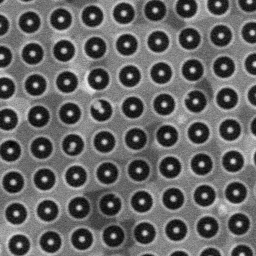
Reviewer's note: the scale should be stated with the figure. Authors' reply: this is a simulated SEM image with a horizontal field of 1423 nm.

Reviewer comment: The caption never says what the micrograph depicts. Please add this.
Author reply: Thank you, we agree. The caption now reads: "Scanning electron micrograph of an array of small figures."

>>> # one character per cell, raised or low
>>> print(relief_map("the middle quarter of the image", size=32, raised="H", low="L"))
HHHHHHHHHHHHHHHLLLHHHHLLLLLHHLLL
LHHHHHHLLLLHHHLLLLLHHHLLLLLHHLLL
LLLHHHLLLLLHHHLLLLLHHLLLLLLHHLLL
LLLLHHLLHLLLHLLLLLLHHHLLLLLHHHLL
HLLLHHLLLLLHHHLLLLLHHHLLLLHHHHHH
LLLHHHLLLLLHHHHLLLHHHHHHHHHHHHHH
LLLHHHHLLLHHHHHHHHHHHHHHHHHHHHHH
HHHHHHHHHHHHHHHHHHHHHHHHLLHHHHHL
HHHHHHHHHHHHHHHLLLLHHHLLLLLHHHLL
HLHHHHHLLLLHHHLLLLLLHHLLLLLLHHLL
LLLLHHHLHLLLHHLLLLLLHHLLLLLLHHLL
LLLLHHLLLLLLHHLLLLLLHHLLLLLLHHHL
LHLLHHHLLLLLHHHLLLLLHHHLLLLHHHHH
LLLLHHHLLLLLHHHHLLHHHHHHHHHHHHHH
LLLLHHHHHLHHHHHHHHHHHHHHHHHHHHHH
HHHHHHHHHHHHHHHHHHHHHHHHLLLHHHHL
HHHHHHHHHHHHHHHHLLLLHHHLLLLLHHHL
HLLHHHHHLLLLHHHLLLLLHHHLLLLLLHHL
LLLLLHHLLLLLLHHLLLLLLHHLLLLLLHHL
LLLLLHHLLLLLLHHLLLLLLHHLLLLLHHHH
LLHLLHHLLLLLLHHLLLLLHHHHLLLHHHHH
LLLLLHHHLLLLHHHHHLLHHHHHHHHHHHHH
LLLLHHHHHHLHHHHHHHHHHHHHHHHHHHHH
HHHHHHHHHHHHHHHHHHHHHHHHHLLLHHHH
HHHHHHHHHHLLHHHHHLLLLHHHLLLLLHHL
HHLLHHHHLLLLLHHHLLLLLHHHLLHLLLHL
LLLLLHHHLLLLLLHHLLLLLLHHLLLLLHHH
LLLLLLHHLLLLLLHHLLLLLHHHLLLLLHHH
LLLLLLHHLLLLLLHHLLLLLHHHHLLLHHHH
LLLLLLHHHLLLLHHHHHLHHHHHHHHHHHHH
HLLLLHHHHHHHHHHHHHHHHHHHHHHHHHHH
HHHHHHHHHHHHHHHHHHHHHHHHHLLLLHHH